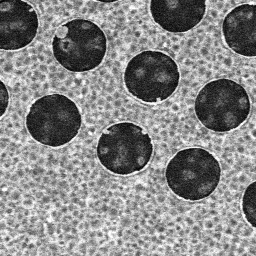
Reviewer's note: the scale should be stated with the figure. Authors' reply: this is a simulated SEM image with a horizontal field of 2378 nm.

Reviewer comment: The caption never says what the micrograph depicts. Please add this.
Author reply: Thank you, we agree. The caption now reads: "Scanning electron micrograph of holes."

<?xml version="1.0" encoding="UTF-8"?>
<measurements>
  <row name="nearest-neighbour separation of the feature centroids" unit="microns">0.7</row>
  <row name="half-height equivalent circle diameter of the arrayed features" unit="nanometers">500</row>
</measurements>